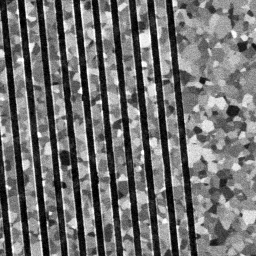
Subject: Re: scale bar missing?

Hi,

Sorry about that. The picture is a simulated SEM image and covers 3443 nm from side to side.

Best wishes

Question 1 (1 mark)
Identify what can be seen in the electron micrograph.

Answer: parallel lines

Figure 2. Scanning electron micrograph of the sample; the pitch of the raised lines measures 248 nm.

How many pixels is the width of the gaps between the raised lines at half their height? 7.21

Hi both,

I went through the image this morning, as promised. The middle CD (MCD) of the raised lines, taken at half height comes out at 10.8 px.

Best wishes